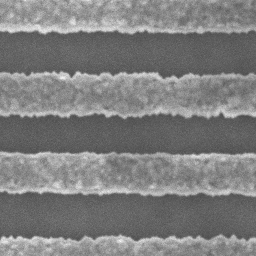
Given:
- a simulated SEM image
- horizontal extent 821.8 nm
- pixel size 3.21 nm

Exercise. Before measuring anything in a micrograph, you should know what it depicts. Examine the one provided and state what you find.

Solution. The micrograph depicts lines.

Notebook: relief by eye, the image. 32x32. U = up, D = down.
UUUUUUUUUUUUUUUUUUUUUUUUUUUUUUUU
UUUUUUUUUUUUUUUUUUUUUUUUUUUUUUUU
UUUUUUUUUUUUUUUUUUUUUUUUUUUUUUUU
UUUUUUUUUUUUUUUUUUUUUUUUUUUUUUUU
DDDDDDDDDDDDDDDDDDDDDDDDDDDDDDDD
DDDDDDDDDDDDDDDDDDDDDDDDDDDDDDDD
DDDDDDDDDDDDDDDDDDDDDDDDDDDDDDDD
DDDDDDDDDDDDDDDDDDDDDDDDDDDDDDDD
DDDDDDDDDDDDDDDDDDDDDDDDDDDDDDDD
UUUUUUUUUUUUUUUUUUUUDDDUUUUUUUUU
UUUUUUUUUUUUUUUUUUUUUUUUUUUUUUUU
UUUUUUUUUUUUUUUUUUUUUUUUUUUUUUUU
UUUUUUUUUUUUUUUUUUUUUUUUUUUUUUUU
UUUUUUUUUUUUUUUUUUUUUUUUUUUUUUUU
UDDUUDDUUDUDDUDUUUDDDDDUDUUDUUDU
DDDDDDDDDDDDDDDDDDDDDDDDDDDDDDDD
DDDDDDDDDDDDDDDDDDDDDDDDDDDDDDDD
DDDDDDDDDDDDDDDDDDDDDDDDDDDDDDDD
DDDDDDDDDDDDDDDDDDDDDDDDDDDDDDDD
UUUUUUUUUUUUUUUUUUUUUUUUUUUUUUUU
UUUUUUUUUUUUUUUUUUUUUUUUUUUUUUUU
UUUUUUUUUUUUUUUUUUUUUUUUUUUUUUUU
UUUUUUUUUUUUUUUUUUUUUUUUUUUUUUUU
UUUUUUUUUUUUUUUUUUUUUUUUUUUUUUUU
DDDDDDDDDDDDDDDDDDDDDDDDDDDDDDDD
DDDDDDDDDDDDDDDDDDDDDDDDDDDDDDDD
DDDDDDDDDDDDDDDDDDDDDDDDDDDDDDDD
DDDDDDDDDDDDDDDDDDDDDDDDDDDDDDDD
DDDDDDDDDDDDDDDDDDDDDDDDDDDDDDDD
DDDDDDDDDDDDDDDUDDDDDDDDDDDUDDDD
UUUUUUUUUUUUUUUUUUUUUUUUUUUUUUUU
UUUUUUUUUUUUUUUUUUUUUUUUUUUUUUUU